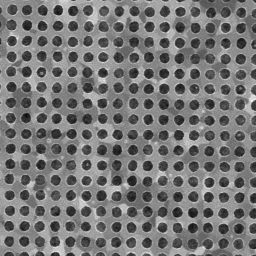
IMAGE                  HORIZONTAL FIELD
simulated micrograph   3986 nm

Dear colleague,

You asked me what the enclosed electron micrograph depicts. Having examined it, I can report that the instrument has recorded a regular array of holes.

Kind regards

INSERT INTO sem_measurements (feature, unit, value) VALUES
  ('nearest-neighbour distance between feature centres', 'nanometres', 233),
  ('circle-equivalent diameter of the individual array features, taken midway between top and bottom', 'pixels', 10.9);